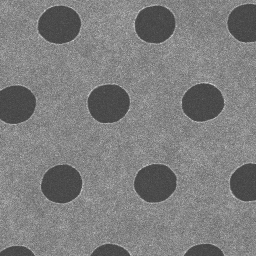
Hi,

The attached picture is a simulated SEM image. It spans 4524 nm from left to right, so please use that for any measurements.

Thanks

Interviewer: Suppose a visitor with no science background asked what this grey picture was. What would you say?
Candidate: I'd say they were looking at holes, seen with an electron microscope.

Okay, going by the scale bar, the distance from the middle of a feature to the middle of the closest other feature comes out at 1630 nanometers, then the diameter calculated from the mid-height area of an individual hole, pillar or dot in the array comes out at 0.715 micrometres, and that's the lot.